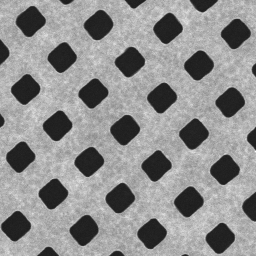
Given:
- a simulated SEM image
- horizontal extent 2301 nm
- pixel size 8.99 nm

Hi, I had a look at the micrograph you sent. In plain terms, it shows a regular array of holes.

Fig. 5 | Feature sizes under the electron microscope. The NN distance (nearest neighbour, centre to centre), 431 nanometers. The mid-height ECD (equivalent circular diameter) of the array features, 27.1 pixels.